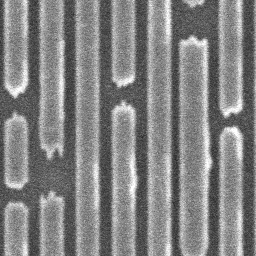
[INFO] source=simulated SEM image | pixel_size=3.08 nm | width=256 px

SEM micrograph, parallel lines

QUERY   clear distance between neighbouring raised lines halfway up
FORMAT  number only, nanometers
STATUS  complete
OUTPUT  42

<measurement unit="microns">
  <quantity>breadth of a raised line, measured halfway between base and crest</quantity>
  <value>0.0663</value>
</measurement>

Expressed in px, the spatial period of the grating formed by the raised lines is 35.8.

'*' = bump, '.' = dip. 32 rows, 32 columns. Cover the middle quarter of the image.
...*****....*****....*****...***
...*****....*****....*****...***
...*****....*****....*****...***
...*****....*****....*****...***
...******....****....*****...***
...******............*****...***
...*****.............*****...***
...*****.............*****...***
...*****.............*****...***
...******............*****...***
...******.....*......*****...***
...******...*****....*****...***
...******...*****....*****...***
...******...*****....*****...***
...*****....*****....*****...***
...*****....*****....*****...***
...*****....*****....*****...***
...*****....*****....*****...***
...*****....*****....*****...***
...*****....*****....*****...***
...*****....*****....*****...***
...*****....*****....*****...***
...*****....*****....*****...***
...*****....*****....*****...***
...*****....*****....*****...***
...*****....*****....*****...***
...*****....******...*****...***
...*****....******...*****...***
...*****....******...*****...***
...*****....******...*****...***
...******...******...*****...***
...******...******...*****...***